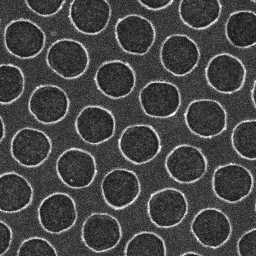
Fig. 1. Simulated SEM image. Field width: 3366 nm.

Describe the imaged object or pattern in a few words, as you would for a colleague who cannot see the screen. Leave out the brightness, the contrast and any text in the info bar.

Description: a regular array of holes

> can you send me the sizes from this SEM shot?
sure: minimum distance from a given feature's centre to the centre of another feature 631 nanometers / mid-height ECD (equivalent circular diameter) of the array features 489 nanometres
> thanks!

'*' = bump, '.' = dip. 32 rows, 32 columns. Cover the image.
****....*....*****...**....*****
*****..**.....*********....*****
*********....**...*****....**...
*....*****...**....*********....
*....**********....***.******...
*....**...*****....**...*****...
*....*.....*****..**.....*******
******.....*********.....**...**
..*****....**...*****...**....**
...*****..**.....*********....**
...*********.....**..*****....**
...*....*****...**....**********
..**....**********....**********
****....***.******....**....****
****....**....*****..**.....****
**********....*********.....**..
**...*****....**...*****...**...
**....*****..**.....*********...
**....*********.....**..*****...
**....**...*****...**....*****..
***..**.....*********.....******
*******.....**..*****....**....*
...*****...**....*****..***....*
....*********....**********....*
....**..*****....**....****....*
...**....*****..***....*********
*****....**********....**..*****
*****....**...*****....*....****
.*****..**.....*********.....***
.*********.....**..******....*..
.**...*****...**....*****...**..
.*.....*********.....*********..